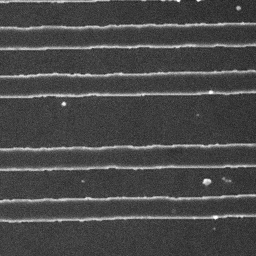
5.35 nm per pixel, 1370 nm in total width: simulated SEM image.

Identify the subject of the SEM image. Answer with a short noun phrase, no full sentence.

lines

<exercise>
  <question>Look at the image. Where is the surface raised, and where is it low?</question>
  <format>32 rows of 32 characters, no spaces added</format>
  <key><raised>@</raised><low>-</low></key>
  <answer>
--------------------------------
--------------------------------
--------------------------------
@@-@@@@@@@@@@@@@@@@@@@@@@@@@@@@@
@@@@@@@@@@@@@@@@@@@@@@@@@@@@@@@@
@@@@@@@@@@@@@@@@@@@@@@@@@@@@@@@@
--------------------------------
--------------------------------
--------------------------------
--@@@@@@@@@@@@@@@@@@@@@@@@@@@@@@
@@@@@@@@@@@@@@@@@@@@@@@@@@@@@@@@
@@@@@@@@@@@@@@@@@@@@@@@@@@@@@@@@
--------------------------------
--------------------------------
--------------------------------
--------------------------------
--------------------------------
--------------------------------
---------@@-@@@@@@@@@@@@@@@@@@@@
@@@@@@@@@@@@@@@@@@@@@@@@@@@@@@@@
@@@@@@@@@@@@@@@@@@@@@@@@@@@@@@@@
--------------------------------
--------------------------------
--------------------------------
-----------------------------@@@
@@@@@@@@@@@@@@@@@@@@@@@@@@@@@@@@
@@@@@@@@@@@@@@@@@@@@@@@@@@@@@@@@
@@@@@@@@@@@-@-------------------
--------------------------------
--------------------------------
--------------------------------
--------------------------------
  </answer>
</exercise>